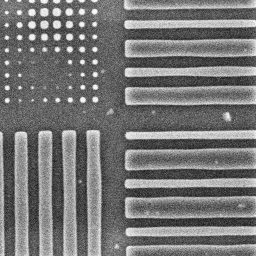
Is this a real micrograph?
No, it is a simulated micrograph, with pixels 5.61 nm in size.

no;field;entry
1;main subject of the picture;groups of lines, slits or small figures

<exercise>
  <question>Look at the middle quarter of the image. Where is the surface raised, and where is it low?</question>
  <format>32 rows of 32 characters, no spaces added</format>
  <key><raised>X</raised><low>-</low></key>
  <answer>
--------------------------------
---------------XXXXXXXXXXXXXXXXX
-------X-------XXXXXXXXXXXXXXXXX
--------------------------------
--------------------------------
--------------------------------
---------------XXXXXXXXXXXXXXXXX
---------------XXXXXXXXXXXXXXXXX
----------------XXXXXXXXXXXXXXXX
----------------XXXXXXXXXXXXXXXX
--------------------------------
--------------------------------
--------------------------------
--------------------------------
--------------------------------
--------------------------------
--------------------------------
XXX---XXX-------XXXXXXXXXXXXXXXX
XXX---XXX-------XXXXXXXXXXXXXXXX
XXX---XXX-----------------------
XXX---XXX-----------------------
XXX---XXX-----------------------
XXX---XXX-------XXXXXXXXXXXXXXXX
XXX---XXX-------XXXXXXXXXXXXXXXX
XXX---XXX------XXXXXXXXXXXXXXXXX
XXX---XXX------XXXXXXXXXXXXXXXXX
XXX---XXX-----------------------
XXX---XXX-----------------------
XXX---XXX-----------------------
XXX---XXX------XXXXXXXXXXXXXXXXX
XXX---XXX------XXXXXXXXXXXXXXXXX
XXX---XXX-----------------------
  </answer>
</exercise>